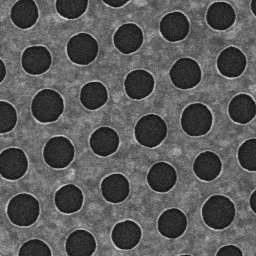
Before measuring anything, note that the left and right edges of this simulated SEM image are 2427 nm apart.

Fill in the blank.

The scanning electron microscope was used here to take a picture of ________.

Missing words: a regular array of holes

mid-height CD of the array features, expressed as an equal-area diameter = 290 nm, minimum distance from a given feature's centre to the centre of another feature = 0.448 µm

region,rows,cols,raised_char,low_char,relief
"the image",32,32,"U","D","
UUDDUUUDDDDUUDDDUUUUUUUUUUDDDUUD
UDDDDUUDDDDUUUUUUUUUUUUUUUDDDUUU
UDDDDUUUUUUUUUUUUUUUDDDDUUDDDUUU
UUUDUUUUUUUUUUUDDDUUDDDDUUDDDUUU
UUUUUUUUUDDUUUDDDDUUDDDUUUUUUUUU
UUUUUUUUDDDDUUDDDDUUUUUUUUUUUUUU
UUUDDDUUDDDDUUUDDUUUUUUUUUUUDDUU
UUUDDDUUUDDDUUUUUUUUUUDDUUUDDDDU
DUUDDDUUUUUUUUUUUUUUUDDDDUUDDDDU
DUUUUUUUUUUUUUUUDDDUUDDDDUUUDDUU
UUUUUUUUUUUDDUUUDDDUUUDDDUUUUUUU
UUUUUDDUUUDDDUUUDDDUUUUUUUUUUUUU
UUUUDDDDUUDDDUUUUUUUUUUUUUUUUDDD
DDUUDDDDUUUDUUUUUUUUUUUDDDUUUDDD
DDUUDDDUUUUUUUUUUUDDUUUDDDDUUDDD
DDUUUUUUUUUUUUUUUDDDDUUDDDDUUUDU
DUUUUUUUUUUUDDUUUDDDDUUDDDUUUUUU
UUUUUUDDDUUDDDDUUDDDUUUUUUUUUUUD
UDUUUUDDDUUDDDDUUUUUUUUUUUUUUUDD
DDDUUDDDDUUUUUUUUUUUUUUUUDDUUUDD
DDDUUUDDDUUUUUUUUUUDDUUUDDDDUUDD
DDDUUUUUUUUUUUUUUUUDDDUUDDDDUUUU
UDUUUUUUUUUUUDDDUUDDDDUUUDDUUUUU
UUUUUUUDDDUUUDDDUUUDDDUUUUUUUUUU
UUDDUUUDDDUUUDDDUUUUUUUUUUUDUUUD
UDDDDUUDDDUUUUUUUUUUUUUUUUDDDUUD
UDDDDUUUDUUUUUUUUUUUDDDUUDDDDUUU
UDDDDUUUUUUUUUUUUUUUDDDUUDDDDUUU
UUUUUUUUUUUUUUDDDDUUDDDUUUDDUUUU
UUUUUUUUUDDDUUDDDDUUDDDUUUUUUUUU
UUUDDDUUDDDDUUDDDUUUUUUUUUUUUUUU
UUDDDDUUDDDDUUUUUUUUUUUUUUUDDDUU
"